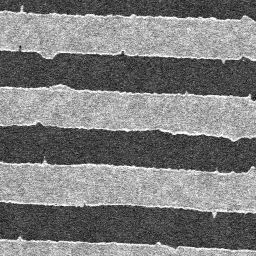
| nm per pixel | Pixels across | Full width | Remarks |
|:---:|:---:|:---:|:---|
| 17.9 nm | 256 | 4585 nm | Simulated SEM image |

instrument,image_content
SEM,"one or a few lines or trenches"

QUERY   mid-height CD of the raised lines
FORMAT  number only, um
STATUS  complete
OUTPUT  0.698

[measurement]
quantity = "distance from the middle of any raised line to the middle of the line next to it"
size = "1.35 µm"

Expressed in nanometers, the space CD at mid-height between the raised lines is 669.